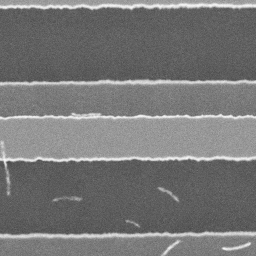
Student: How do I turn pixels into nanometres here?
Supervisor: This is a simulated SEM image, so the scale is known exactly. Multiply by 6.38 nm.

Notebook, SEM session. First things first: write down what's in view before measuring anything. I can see lines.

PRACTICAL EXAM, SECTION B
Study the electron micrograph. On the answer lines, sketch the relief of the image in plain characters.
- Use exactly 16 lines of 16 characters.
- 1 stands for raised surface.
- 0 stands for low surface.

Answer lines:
0000000000000000
0000000000000000
0000000000000000
0000000000000000
0000000000000000
1111111111111111
1111111111111111
1111111111111111
1111111111111111
1111111111111111
0000000000000000
0000000000000000
0000000000000000
0000000000000000
0000000000000000
1111111111111111